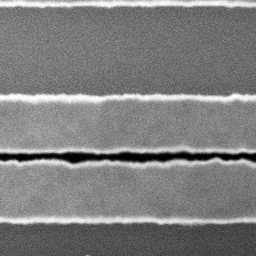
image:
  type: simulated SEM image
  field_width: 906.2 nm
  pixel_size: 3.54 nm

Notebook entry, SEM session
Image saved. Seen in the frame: lines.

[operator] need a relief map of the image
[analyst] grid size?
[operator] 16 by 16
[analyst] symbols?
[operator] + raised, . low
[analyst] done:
................
................
................
................
................
................
++++++++++++++++
++++++++++++++++
++++++++++++++++
++++++++++++++++
++++++++++++++++
++++++++++++++++
++++++++++++++++
++++++++++++++++
................
................